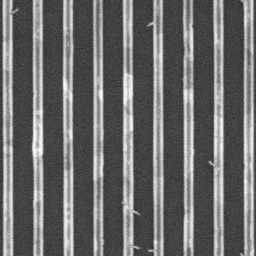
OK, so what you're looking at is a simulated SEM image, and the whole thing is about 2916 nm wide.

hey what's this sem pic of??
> parallel lines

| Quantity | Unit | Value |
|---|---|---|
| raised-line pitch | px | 30.1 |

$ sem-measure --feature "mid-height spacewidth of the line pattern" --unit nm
269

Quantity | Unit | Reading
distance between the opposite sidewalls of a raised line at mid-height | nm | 75.4